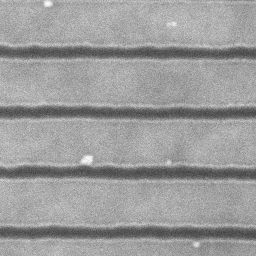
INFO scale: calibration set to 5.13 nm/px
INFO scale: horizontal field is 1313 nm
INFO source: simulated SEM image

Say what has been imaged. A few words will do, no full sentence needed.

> lines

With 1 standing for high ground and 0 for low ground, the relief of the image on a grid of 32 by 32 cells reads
00000000000000000000000000000000
00000000000000000000000000000000
00000000000000000000000000000000
00000000000000000000000000000000
00000000000000000000000000000000
10011000111000000010000000000000
11111111111111111111111111111111
01111111110011111111111111111111
00000000000000000000000000000000
00000000000000000000000000000000
00000000000000000000000000000000
00000000000000000000000000000000
00000000000000000000000000000000
11111111111111111111111111111111
11111111111111111111111111111111
00000000000000000000000000000000
00000000000000000000000000000000
00000000000000000000000000000000
00000000000000000000000000000000
00000000000000000000000000000000
00111110001111000000111100000000
11111111111111111111111111111111
11111001001111111111111111111111
00000000000000000000000000000000
00000000000000000000000000000000
00000000000000000000000000000000
00000000000000000000000000000000
00000000000000000000000000000000
11111111111111111111111111111111
11111111111111111111111111111111
00000000000000000000000000000000
00000000000000000000000000000000